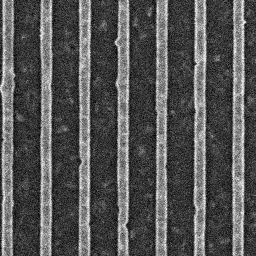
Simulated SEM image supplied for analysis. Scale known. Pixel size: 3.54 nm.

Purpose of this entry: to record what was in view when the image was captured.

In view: parallel lines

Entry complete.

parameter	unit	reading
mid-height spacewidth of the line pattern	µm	0.102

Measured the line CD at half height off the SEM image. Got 35.4 nanometers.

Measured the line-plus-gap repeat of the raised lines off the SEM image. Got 0.136 um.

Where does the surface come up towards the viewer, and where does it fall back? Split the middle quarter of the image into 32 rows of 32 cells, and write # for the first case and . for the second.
....##........##.......###......
....##........##.......###......
....##........##.......###......
....##.......###.......###......
....##.......###.......###......
....##.......###.......###......
....##........##.......###......
....##........##.......###......
....##........##.......###......
....##........##.......##.......
....##........##.......##.......
....##........##.......##.......
....##........##.......##.......
....##........##.......##.......
....##........##.......##.......
....##........##.......##.......
....##........##.......##.......
....##........##.......##.......
....##........##.......##.......
....##........##.......##.......
....##........##.......##.......
....##........##.......##.......
....##........##.......##.......
....##........##.......##.......
.....#........##.......##.......
....##........##.......##.......
....##........##.......##.......
....##........##.......##.......
....##........##.......##.......
....##........##.......###......
....##........##.......###......
....##........##.......###......